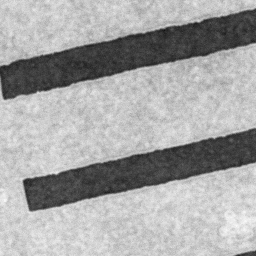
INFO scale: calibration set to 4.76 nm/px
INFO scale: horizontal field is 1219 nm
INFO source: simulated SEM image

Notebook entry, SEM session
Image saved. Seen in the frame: one or a few lines or trenches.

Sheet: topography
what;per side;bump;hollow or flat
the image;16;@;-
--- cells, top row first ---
@@@@@@@@@@@@@@@@
@@@@@@@@@@@-----
@@@@@@@---------
@@-----------@@@
--------@@@@@@@@
----@@@@@@@@@@@@
@@@@@@@@@@@@@@@@
@@@@@@@@@@@@@@@@
@@@@@@@@@@@@@@--
@@@@@@@@@-------
@@@@@----------@
@---------@@@@@@
@@---@@@@@@@@@@@
@@@@@@@@@@@@@@@@
@@@@@@@@@@@@@@@@
@@@@@@@@@@@@@@@@